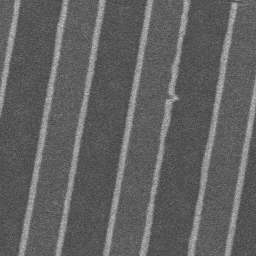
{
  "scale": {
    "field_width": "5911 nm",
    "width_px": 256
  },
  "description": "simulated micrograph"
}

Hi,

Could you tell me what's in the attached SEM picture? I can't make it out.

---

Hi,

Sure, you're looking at one or a few lines or trenches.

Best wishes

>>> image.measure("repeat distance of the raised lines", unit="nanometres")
1920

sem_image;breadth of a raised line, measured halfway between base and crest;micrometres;0.853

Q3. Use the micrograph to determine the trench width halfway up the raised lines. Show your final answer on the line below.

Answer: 1.07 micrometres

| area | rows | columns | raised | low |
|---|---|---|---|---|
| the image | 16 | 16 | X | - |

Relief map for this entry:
X---XX---XXX---X
X---XX---XX---XX
X---XX---XX---XX
X---XX---XX---XX
---XXX---XX---XX
---XX---XXX---XX
---XX---XXX---XX
---XX---XX---XXX
---XX---XX---XXX
--XXX---XX---XX-
--XXX---XX---XX-
--XX---XXX---XX-
--XX---XXX---XX-
--XX---XX---XXX-
--XX---XX---XX--
-XXX---XX---XX--